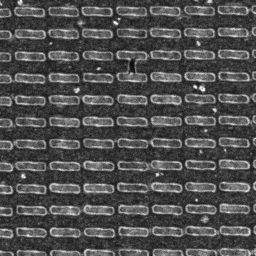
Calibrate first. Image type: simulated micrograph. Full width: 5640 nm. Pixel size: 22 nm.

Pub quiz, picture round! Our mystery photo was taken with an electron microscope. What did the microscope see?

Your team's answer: a regular array of holes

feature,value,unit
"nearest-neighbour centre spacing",484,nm